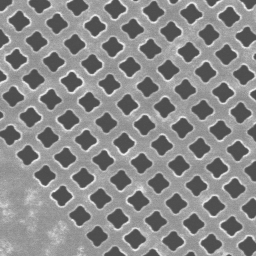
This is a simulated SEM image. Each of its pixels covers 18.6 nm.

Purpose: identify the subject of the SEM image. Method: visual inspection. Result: a regular array of holes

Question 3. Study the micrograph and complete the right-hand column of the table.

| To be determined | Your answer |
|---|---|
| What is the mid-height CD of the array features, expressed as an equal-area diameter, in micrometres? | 0.343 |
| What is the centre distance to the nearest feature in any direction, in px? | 26.6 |